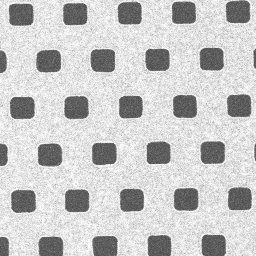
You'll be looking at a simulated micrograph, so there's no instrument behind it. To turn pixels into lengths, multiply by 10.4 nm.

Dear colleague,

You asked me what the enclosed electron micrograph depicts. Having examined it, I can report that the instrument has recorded a regular array of holes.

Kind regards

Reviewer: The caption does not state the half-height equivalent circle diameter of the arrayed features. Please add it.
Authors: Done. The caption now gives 270 nm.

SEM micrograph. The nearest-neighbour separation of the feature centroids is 558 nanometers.